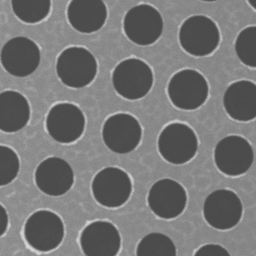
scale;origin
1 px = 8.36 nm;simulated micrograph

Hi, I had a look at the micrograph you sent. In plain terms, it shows a regular array of holes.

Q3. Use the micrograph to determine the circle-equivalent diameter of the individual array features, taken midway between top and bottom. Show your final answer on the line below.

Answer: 0.333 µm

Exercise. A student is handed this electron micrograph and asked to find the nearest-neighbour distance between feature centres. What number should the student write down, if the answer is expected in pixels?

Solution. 55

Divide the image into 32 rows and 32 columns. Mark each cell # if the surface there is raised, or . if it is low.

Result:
#.....###....##################.
##....##.....###....############
###..####....###....###...######
#########...####....###....####.
################....##.....###..
#...#############..####....##...
.....###...############...####..
.....##.....####..############..
.....##.....##.....#############
##.####.....##.....###...#######
########...###.....##.....###...
#.#############....##.....##....
...##################.....##....
....###...############...###....
....##....####...############...
...###.....##....####..#########
######....###.....##....########
#######..####....###.....###...#
.#############...###.....##....#
..##################....###.....
..###....##################....#
..###....###....############...#
..##.....###....####..##########
#####....###....###....#########
############....###....###....##
#############..####....###....##
.####.#############....##.....##
.##.....##################....##
.##.....###...#############..###
###.....##.....###...###########
####...###.....##.....##########
##########.....##.....###....###